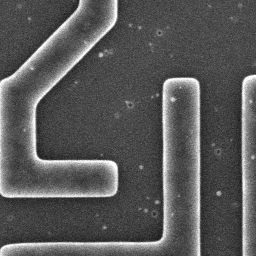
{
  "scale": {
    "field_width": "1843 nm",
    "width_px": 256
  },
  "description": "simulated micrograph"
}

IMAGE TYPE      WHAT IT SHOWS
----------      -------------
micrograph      wiring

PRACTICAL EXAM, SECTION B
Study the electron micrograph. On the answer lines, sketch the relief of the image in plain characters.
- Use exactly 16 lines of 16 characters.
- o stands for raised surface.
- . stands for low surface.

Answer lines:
.....oo.........
....ooo.........
...ooo..........
..ooo...........
.ooo............
ooo.......oo...o
oo........oo...o
oo........oo...o
oo........oo...o
oo........oo...o
ooooooo...oo...o
ooooooo...oo...o
..........oo...o
..........oo...o
..........oo...o
oooooooooooo...o